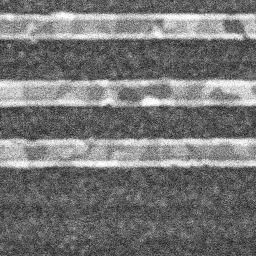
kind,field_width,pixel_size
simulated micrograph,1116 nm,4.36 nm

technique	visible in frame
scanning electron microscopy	one or a few lines or trenches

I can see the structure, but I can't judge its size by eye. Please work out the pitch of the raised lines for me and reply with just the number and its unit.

275 nm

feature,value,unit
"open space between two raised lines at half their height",0.187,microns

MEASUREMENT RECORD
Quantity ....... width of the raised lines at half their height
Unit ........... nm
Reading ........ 89.3